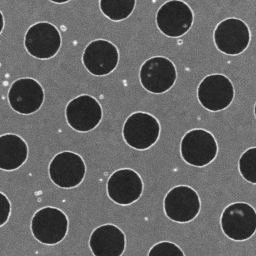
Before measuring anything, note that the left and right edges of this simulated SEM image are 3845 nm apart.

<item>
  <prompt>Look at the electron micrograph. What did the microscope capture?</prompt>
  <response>a regular array of holes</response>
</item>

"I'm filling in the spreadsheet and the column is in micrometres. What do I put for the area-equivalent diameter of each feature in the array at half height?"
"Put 0.543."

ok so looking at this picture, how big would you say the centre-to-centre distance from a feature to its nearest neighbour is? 0.875 micrometres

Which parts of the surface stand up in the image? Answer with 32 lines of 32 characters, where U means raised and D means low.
UUUUUUUUUUUUUDDDDUUUUDDUUUUUUUUU
UUUUUUUUUUUUUDDDUUUUDDDDUUUUUUUU
UUUUUUUUUUUUUUDUUUUUDDDDUUUUDDUU
UUUUDDDUUUUUUUUUUUUUDDDDUUUDDDDU
UUUDDDDDUUUUUUUUUUUUUDUUUUUDDDDU
UUUDDDDDUUUDDDUUUUUUUUUUUUUDDDDU
UUUUDDDUUUDDDDDUUUUUUUUUUUUUDDUU
UUUUUUUUUUDDDDDUUUDDDUUUUUUUUUUU
UUUUUUUUUUUDDDUUUUDDDDUUUUUUUUUU
UUUUUUUUUUUUUUUUUDDDDDUUUUDDUUUU
UUDDDUUUUUUUUUUUUUDDDDUUUDDDDUUU
UDDDDUUUUUUUUUUUUUUDUUUUUDDDDUUU
UDDDDUUUUDDDUUUUUUUUUUUUUDDDDUUU
UUDDDUUUDDDDDUUUUUUUUUUUUUDDUUUU
UUUUUUUUDDDDDUUUDDDUUUUUUUUUUUUU
UUUUUUUUUDDDUUUUDDDDUUUUUUUUUUUU
UUUUUUUUUUUUUUUDDDDDUUUUDDUUUUUU
DDDUUUUUUUUUUUUUDDDDUUUDDDDUUUUU
DDDUUUUUUUUUUUUUUDUUUUUDDDDUUUUU
DDDUUUUDDDUUUUUUUUUUUUUDDDDUUUDD
DDDUUUDDDDDUUUUUUUUUUUUUDDUUUUDD
UUUUUUDDDDDUUUDDDUUUUUUUUUUUUUDD
UUUUUUUDDDUUUUDDDDUUUUUUUUUUUUUD
UUUUUUUUUUUUUDDDDDUUUUDDUUUUUUUU
DUUUUUUUUUUUUUDDDUUUUDDDDUUUUUUU
DUUUUUUUUUUUUUUDUUUUUDDDDUUUUDDU
DUUUUDDDUUUUUUUUUUUUUDDDDUUUDDDD
DUUUDDDDUUUUUUUUUUUUUUDDUUUUDDDD
UUUUDDDDUUUUDDDUUUUUUUUUUUUUDDDD
UUUUDDDDUUUDDDDDUUUUUUUUUUUUDDDU
UUUUUUDUUUUDDDDDUUUUDDUUUUUUUUUU
UUUUUUUUUUUUDDDUUUUDDDDUUUUUUUUU